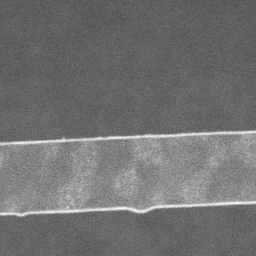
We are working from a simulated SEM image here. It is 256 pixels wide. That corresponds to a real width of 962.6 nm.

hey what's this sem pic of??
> one or a few lines or trenches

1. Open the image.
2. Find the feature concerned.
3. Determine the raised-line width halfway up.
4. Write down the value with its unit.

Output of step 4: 267 nanometres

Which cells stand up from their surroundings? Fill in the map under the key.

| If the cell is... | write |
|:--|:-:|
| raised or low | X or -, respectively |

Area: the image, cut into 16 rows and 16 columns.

----------------
----------------
----------------
----------------
----------------
----------------
----------------
----------------
---------XXXXXXX
XXXXXXXXXXXXXXXX
XXXXXXXXXXXXXXXX
XXXXXXXXXXXXXXXX
XXXXXXXXXXXXXXXX
----------------
----------------
----------------